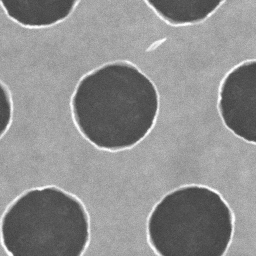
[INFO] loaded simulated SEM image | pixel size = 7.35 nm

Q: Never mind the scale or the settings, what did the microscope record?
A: holes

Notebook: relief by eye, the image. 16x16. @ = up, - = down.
----@@@@@@---@@@
@@-@@@@@@@@@@@@@
@@@@@@@@@@@@@@@@
@@@@@@@@@@@@@@@@
@@@@@@---@@@@@@-
@@@@@-----@@@@--
-@@@@-----@@@@--
-@@@@-----@@@@--
@@@@@----@@@@@@-
@@@@@@@@@@@@@@@@
@@@@@@@@@@@@@@@@
@@@@@@@@@@@@@@@@
@----@@@@@----@@
-----@@@@-----@@
------@@@-----@@
-----@@@@@----@@